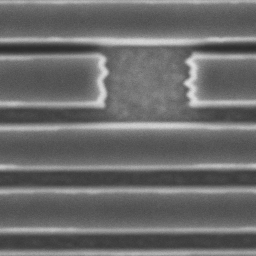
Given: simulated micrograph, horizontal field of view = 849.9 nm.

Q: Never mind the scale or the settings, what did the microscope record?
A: one or a few lines or trenches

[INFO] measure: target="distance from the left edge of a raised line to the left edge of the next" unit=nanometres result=214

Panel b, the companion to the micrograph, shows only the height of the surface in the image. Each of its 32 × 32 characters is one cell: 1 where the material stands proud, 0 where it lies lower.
11111111111111111111111111111111
11111111111111111111111111111111
11111111111111111111111111111111
11111111111111111111111111111111
11111111111111111111111111111111
00000000000000000000000000000000
00000000000000000000000000000000
11111111111110000000000011111111
11111111111110000000000011111111
11111111111110000000000011111111
11111111111110000000000111111111
11111111111110000000000011111111
11111111111110000000000011111111
00000000000000000000000000000000
00000000000000000000000000000000
00000000000000000000000000000000
11111111111111111111111111111111
11111111111111111111111111111111
11111111111111111111111111111111
11111111111111111111111111111111
11111111111111111111111111111111
00000000000000000000000000000000
00000000000000000000000000000000
00000000000000000000000000000000
11111111111111111111111111111111
11111111111111111111111111111111
11111111111111111111111111111111
11111111111111111111111111111111
11111111111111111111111111111111
00000000000000000000000000000000
00000000000000000000000000000000
11111100011111111111111111111111